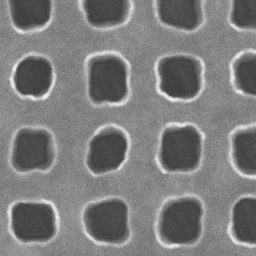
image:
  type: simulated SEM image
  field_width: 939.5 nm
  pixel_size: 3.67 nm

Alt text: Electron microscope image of a regular array of holes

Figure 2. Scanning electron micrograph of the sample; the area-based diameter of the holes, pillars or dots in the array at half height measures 0.157 um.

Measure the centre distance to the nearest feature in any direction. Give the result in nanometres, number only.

264